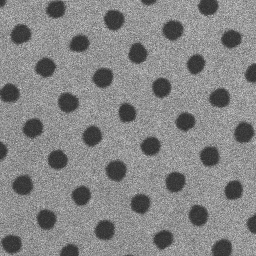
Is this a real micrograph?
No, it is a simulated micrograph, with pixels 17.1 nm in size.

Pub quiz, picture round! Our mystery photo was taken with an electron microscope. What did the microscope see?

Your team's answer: a regular array of holes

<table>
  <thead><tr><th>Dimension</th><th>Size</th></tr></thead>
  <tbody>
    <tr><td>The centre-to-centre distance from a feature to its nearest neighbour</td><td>708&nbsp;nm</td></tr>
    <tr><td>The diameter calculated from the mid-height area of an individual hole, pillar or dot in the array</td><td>0.344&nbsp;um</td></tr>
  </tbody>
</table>